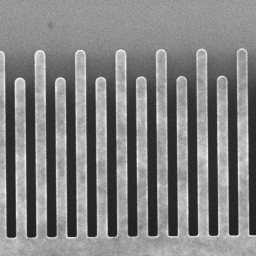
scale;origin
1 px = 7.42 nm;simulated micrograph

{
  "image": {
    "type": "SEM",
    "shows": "groups of lines, slits or small figures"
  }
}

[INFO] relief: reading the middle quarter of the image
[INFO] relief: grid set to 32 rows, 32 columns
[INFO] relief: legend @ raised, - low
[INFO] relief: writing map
---@@--------@@--------@@@------
---@@--------@@--------@@@------
---@@--------@@--------@@@------
---@@----@---@@----@---@@@---@--
---@@---@@---@@---@@@--@@@--@@@-
---@@---@@---@@---@@@--@@@--@@@-
---@@---@@---@@---@@@--@@@--@@@-
---@@---@@@--@@---@@@--@@@--@@@-
---@@---@@@--@@---@@@--@@@--@@@-
---@@---@@@--@@---@@@--@@@--@@@-
---@@---@@@--@@---@@@--@@@--@@@-
---@@---@@@--@@---@@@--@@@--@@@-
---@@---@@@--@@---@@@--@@@--@@@-
---@@---@@@--@@---@@@--@@@--@@@-
---@@---@@@--@@---@@@--@@@--@@@-
---@@---@@@--@@---@@@--@@@--@@@-
---@@---@@@--@@---@@@--@@@--@@@-
---@@---@@@--@@---@@@--@@@--@@@-
---@@---@@@--@@@--@@@--@@@--@@@-
---@@---@@@--@@@--@@@--@@@--@@@-
---@@---@@@--@@@--@@@--@@@--@@@-
---@@@--@@@--@@@--@@@--@@@--@@@-
---@@@--@@@--@@@--@@@--@@@--@@@-
---@@@--@@@--@@@--@@@--@@@--@@@-
---@@@--@@@--@@@--@@@--@@@--@@@-
---@@@--@@@--@@@--@@@--@@@--@@@-
---@@@--@@@--@@@--@@@--@@@--@@@-
---@@@--@@@--@@@--@@@--@@@--@@@-
---@@@--@@@--@@@--@@@--@@@---@@-
---@@@--@@@--@@@--@@@--@@@---@@-
---@@@--@@@--@@@--@@@--@@@---@@-
---@@@--@@@--@@@---@@--@@@---@@-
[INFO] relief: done